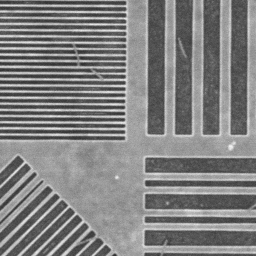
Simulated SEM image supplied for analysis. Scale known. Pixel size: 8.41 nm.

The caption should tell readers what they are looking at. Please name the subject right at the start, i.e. groups of lines, slits or small figures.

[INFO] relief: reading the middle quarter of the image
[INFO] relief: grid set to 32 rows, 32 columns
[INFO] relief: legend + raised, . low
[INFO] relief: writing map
...+............+++++....+++....
................+++++....+++....
........+......++++++....+++....
.........+.....++++++....+++....
...............++++++....+++....
...............++++++....+++....
...............++++++....+++....
...............++++++....+++....
.............++++++++....+++....
................+++++....+++....
...............++++++....+++....
............+++++++++....+++....
................+++++....+++....
...............++++++....++.....
...............++++++....++.....
...............++++++....++.....
...............++++++....++.....
...............++++++....+++....
...............+++++++++++++++++
++++++++++++++++++++++++++++++++
++++++++++++++++++++++++++++++++
++++++++++++++++++++++++++++++++
++++++++++++++++++++++++++++++++
+++++++++++++++++++++...........
++++++++++++++++++++............
++++++++++++++++++++............
++++++++++++++++++++............
++++++++++++++++++++++++++++++++
++++++++++++++++++++++++++++++++
++++++++++++++++++++............
++++++++++++++++++++............
++++++++++++++++++++++++++++++++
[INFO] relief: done